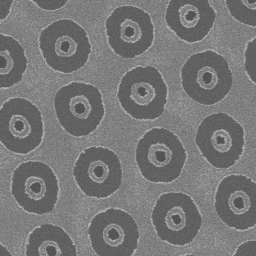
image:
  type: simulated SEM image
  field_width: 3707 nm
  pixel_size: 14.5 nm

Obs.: a regular array of ring-shaped grooves with a dot in the middle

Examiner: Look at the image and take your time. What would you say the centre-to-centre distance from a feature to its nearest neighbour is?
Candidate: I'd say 0.926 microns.